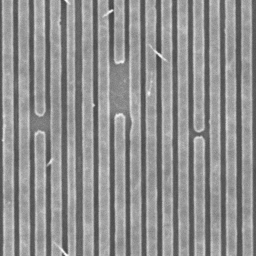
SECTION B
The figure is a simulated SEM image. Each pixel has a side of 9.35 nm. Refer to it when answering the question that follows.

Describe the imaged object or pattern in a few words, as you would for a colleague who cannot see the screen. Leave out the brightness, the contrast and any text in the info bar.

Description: parallel lines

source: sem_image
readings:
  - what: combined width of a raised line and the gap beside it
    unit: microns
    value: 0.149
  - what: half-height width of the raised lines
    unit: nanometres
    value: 97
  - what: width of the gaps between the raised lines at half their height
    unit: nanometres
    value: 49.1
